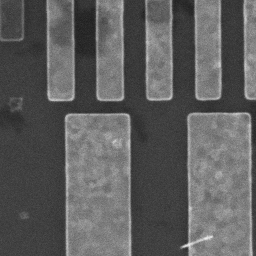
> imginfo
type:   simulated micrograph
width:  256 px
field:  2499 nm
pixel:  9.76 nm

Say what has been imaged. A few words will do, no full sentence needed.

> wiring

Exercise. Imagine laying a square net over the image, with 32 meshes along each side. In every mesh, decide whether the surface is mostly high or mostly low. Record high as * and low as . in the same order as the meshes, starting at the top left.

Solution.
***...***...***...***...****...*
***...***...***...****..****...*
***...***...***...****..****...*
***...***...***...***....***...*
***...***...***...***....***...*
......***...***...***....***...*
......***...***...****...***...*
......***...***...****...***...*
......***...***...****...***...*
......***...***...****...***...*
......***...***...****...***...*
......***...***...****...***...*
......***....**....**....*......
................................
.........*******........*******.
........********........*******.
........********........*******.
........********........*******.
........********........*******.
........********........*******.
........********........*******.
........********........*******.
........********........*******.
........********........*******.
........********........*******.
........********........*******.
........********........*******.
........********........*******.
........********........*******.
........********........*******.
........********........*******.
........********........********